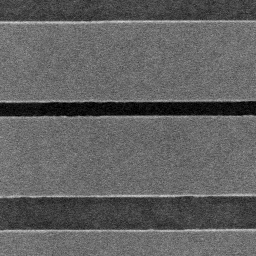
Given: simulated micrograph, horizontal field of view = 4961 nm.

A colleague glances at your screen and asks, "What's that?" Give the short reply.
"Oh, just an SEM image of lines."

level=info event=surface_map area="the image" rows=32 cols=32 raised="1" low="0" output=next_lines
00000000000000000000000000000000
00000000000000000000000000000000
00000000000000000000000000000000
11111111111111111111111111111111
11111111111111111111111111111111
11111111111111111111111111111111
11111111111111111111111111111111
11111111111111111111111111111111
11111111111111111111111111111111
11111111111111111111111111111111
11111111111111111111111111111111
11111111111111111111111111111111
11111111111111111111111111111111
00000000000000000000000000000000
00000000000000000000000000010011
11111111111111111111111111111111
11111111111111111111111111111111
11111111111111111111111111111111
11111111111111111111111111111111
11111111111111111111111111111111
11111111111111111111111111111111
11111111111111111111111111111111
11111111111111111111111111111111
11111111111111111111111111111111
11111111111111111111111011000000
00000000000000000000000000000000
00000000000000000000000000000000
00000000000000000000000000000000
00000000000000000000000000000000
11111111111111111111111111111111
11111111111111111111111111111111
11111111111111111111111111111111